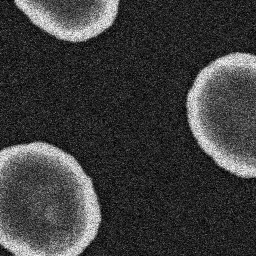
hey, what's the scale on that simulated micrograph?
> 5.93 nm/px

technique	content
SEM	raised bodies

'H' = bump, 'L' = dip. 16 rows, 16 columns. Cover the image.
LLHHHHHLLLLLLLLL
LLLHHHLLLLLLLLLL
LLLLLLLLLLLLLLLL
LLLLLLLLLLLLLLLL
LLLLLLLLLLLLLHHH
LLLLLLLLLLLLHHHH
LLLLLLLLLLLLHHHH
LLLLLLLLLLLLHHHH
LLLLLLLLLLLLHHHH
LHHLLLLLLLLLLHHH
HHHHHLLLLLLLLLLH
HHHHHLLLLLLLLLLL
HHHHHHLLLLLLLLLL
HHHHHHLLLLLLLLLL
HHHHHHLLLLLLLLLL
LHHHHLLLLLLLLLLL